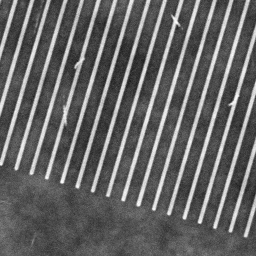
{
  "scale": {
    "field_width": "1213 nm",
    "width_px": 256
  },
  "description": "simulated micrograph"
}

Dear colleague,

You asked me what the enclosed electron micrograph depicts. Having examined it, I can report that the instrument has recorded parallel lines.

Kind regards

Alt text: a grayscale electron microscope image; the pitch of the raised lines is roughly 75.6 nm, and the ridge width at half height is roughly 13.1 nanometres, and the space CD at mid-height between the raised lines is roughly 0.062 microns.